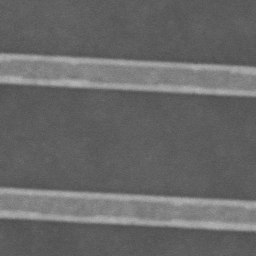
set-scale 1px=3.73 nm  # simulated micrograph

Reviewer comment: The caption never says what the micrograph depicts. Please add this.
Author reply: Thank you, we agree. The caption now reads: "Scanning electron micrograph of one or a few lines or trenches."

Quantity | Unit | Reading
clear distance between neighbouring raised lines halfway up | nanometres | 410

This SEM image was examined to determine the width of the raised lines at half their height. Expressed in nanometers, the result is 92.7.